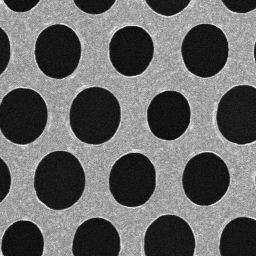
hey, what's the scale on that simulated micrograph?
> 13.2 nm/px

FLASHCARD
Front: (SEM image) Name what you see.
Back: a regular array of holes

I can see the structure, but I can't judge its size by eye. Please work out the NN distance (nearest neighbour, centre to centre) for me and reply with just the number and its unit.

964 nanometres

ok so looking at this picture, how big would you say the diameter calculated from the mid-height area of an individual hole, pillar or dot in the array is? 666 nm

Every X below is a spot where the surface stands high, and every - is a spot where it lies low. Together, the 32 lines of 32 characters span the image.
X----XXXX-----XXXX------XXXX----
XX-XXXXXXXX--XXXXXX---XXXXXXX--X
XXXXXXXXXXXXXXXXXXXXXXXXXXXXXXXX
XXXXXX---XXXXXX---XXXXXX---XXXXX
-XXXX-----XXXX-----XXXX-----XXXX
-XXX------XXXX-----XXXX-----XXXX
-XXX------XXXX-----XXXX------XXX
-XXX------XXXX-----XXXX-----XXXX
-XXXX-----XXXX----XXXXX-----XXXX
XXXXXX--XXXXXXXX-XXXXXXXX-XXXXXX
XXXXXXXXXXXXXXXXXXXXXXXXXXXXXXXX
X----XXXXX----XXXXXX--XXXXXX----
-----XXXX------XXXX----XXXXX----
------XXX------XXXX-----XXX-----
------XXX------XXX------XXX-----
------XXX------XXXX-----XXX-----
-----XXXX-----XXXXX----XXXX-----
X---XXXXXX----XXXXXXXXXXXXXX----
XXXXXXXXXXXXXXXXXXXXXXXXXXXXXXXX
XXXXXX---XXXXXX---XXXXXX---XXXXX
-XXXX-----XXXX-----XXXX-----XXXX
-XXX-------XXX-----XXXX------XXX
-XXX-------XXX------XXX------XXX
-XXX-------XXX-----XXXX------XXX
-XXXX-----XXXX-----XXXX-----XXXX
XXXXX----XXXXXX---XXXXXX---XXXXX
XXXXXXXXXXXXXXXXXXXXXXXXXXXXXXXX
XXXXXXXXXXX--XXXXXX----XXXXXX---
X----XXXXX----XXXX------XXXX----
-----XXXX------XXX------XXXX----
------XXX------XXX------XXX-----
-----XXXX------XXX------XXXX----